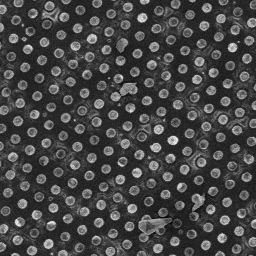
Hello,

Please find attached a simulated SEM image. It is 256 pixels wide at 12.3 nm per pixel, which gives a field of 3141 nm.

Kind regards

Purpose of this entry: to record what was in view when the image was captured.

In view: a regular array of raised bodies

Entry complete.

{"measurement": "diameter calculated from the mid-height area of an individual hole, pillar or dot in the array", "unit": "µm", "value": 0.104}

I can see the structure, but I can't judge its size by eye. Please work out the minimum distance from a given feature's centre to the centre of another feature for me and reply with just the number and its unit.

218 nanometers